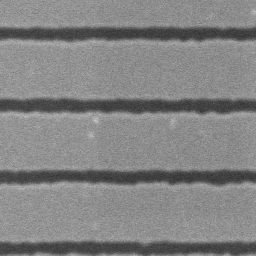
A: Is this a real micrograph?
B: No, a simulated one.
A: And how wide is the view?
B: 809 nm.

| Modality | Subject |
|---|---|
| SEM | lines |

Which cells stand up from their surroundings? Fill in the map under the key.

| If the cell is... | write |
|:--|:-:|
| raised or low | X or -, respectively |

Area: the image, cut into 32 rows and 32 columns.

XXXXXXXXXXXXXXXXXXXXXXXXXXXXXXXX
XXXXXXXXXXXXXXXXXXXXXXXXXXXXXXXX
XXXXXXXXXXXXXXXXXXXXXXXXXXXXXXXX
--------------------------------
--------------------------------
XXXXXXXXXXXXXXXXXXXXXXXXXXXXXXXX
XXXXXXXXXXXXXXXXXXXXXXXXXXXXXXXX
XXXXXXXXXXXXXXXXXXXXXXXXXXXXXXXX
XXXXXXXXXXXXXXXXXXXXXXXXXXXXXXXX
XXXXXXXXXXXXXXXXXXXXXXXXXXXXXXXX
XXXXXXXXXXXXXXXXXXXXXXXXXXXXXXXX
XXXXXXXXXXXXXXXXXXXXXXXXXXXXXXXX
--------------------------------
--------------------------------
XXXXXXXXXXXXXXXXXXXXXXXXXXXXXXXX
XXXXXXXXXXXXXXXXXXXXXXXXXXXXXXXX
XXXXXXXXXXXXXXXXXXXXXXXXXXXXXXXX
XXXXXXXXXXXXXXXXXXXXXXXXXXXXXXXX
XXXXXXXXXXXXXXXXXXXXXXXXXXXXXXXX
XXXXXXXXXXXXXXXXXXXXXXXXXXXXXXXX
XXXXXXXXXXXXXXXXXXXXXXXXXXXXXXXX
--------------------------------
--------------------------------
XXXXXXXXXXXXXXXXXXXXXXXXXXXXXXXX
XXXXXXXXXXXXXXXXXXXXXXXXXXXXXXXX
XXXXXXXXXXXXXXXXXXXXXXXXXXXXXXXX
XXXXXXXXXXXXXXXXXXXXXXXXXXXXXXXX
XXXXXXXXXXXXXXXXXXXXXXXXXXXXXXXX
XXXXXXXXXXXXXXXXXXXXXXXXXXXXXXXX
XXXXXXXXXXXXXXXXXXXXXXXXXXXXXXXX
--------------------------------
--------------------------------